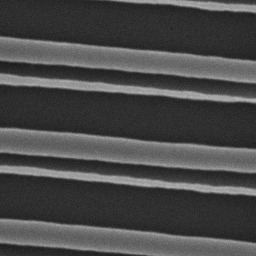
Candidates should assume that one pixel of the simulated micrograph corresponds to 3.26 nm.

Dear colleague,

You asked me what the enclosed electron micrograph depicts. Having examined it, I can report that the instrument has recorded lines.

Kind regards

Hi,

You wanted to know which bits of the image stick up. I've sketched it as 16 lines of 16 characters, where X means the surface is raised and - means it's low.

------------XXXX
----------------
XX--------------
XXXXXXXXXXXXX---
XXXXXXXXXXXXXXXX
----XXXXXXXXXXXX
----------------
----------------
XXXXXX----------
XXXXXXXXXXXXXXXX
XXXXXXXXXXXXXXXX
--------XXXXXXXX
----------------
----------------
XXXXXXXXX-------
XXXXXXXXXXXXXXXX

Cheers